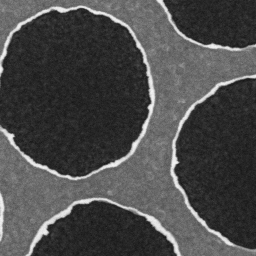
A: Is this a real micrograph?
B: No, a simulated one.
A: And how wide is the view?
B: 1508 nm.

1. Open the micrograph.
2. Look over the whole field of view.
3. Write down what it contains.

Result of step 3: holes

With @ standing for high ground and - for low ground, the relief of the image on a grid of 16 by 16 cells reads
@@@@@@@@@@------
@@-----@@@@-----
@-------@@@@----
---------@@@@@@@
---------@@@@@@@
---------@@@@@--
---------@@@----
---------@@@----
@--------@@-----
@-------@@@-----
@@@---@@@@@-----
@@@@@@@@@@@-----
@@@@@@@@@@@@----
@@@@-----@@@----
@@@-------@@@@--
@@---------@@@@-